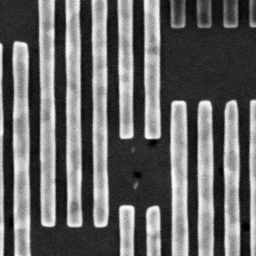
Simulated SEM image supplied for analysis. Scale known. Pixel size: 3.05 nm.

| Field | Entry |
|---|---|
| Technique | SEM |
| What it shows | wiring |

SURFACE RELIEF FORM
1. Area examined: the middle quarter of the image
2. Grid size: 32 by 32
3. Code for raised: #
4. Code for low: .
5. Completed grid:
.###...####...###...####........
.###...####...###...####........
.###...####...###...####........
.###...####...###...####........
.###...####...###...####........
.###...####...###...####........
.###...####...###...####........
.###...####...###...####........
.###...####...###...####........
.###...####...###...####...###..
.###...####...###...####...###..
.###...####...###...####...###..
.###...####...###...####...####.
.###...####...###...####...####.
.###...####...###...####...####.
.###...####...###...####...####.
.###...####...###...####...####.
.###...####...###...####...####.
.###...####...##.....###...####.
.###...####................####.
.###...####................####.
.###...####................####.
.###...####................####.
.###...####................####.
.###...####................####.
.###...####................####.
.###...####................####.
.###...####................####.
.###...####................####.
.###...####................####.
.###....###................####.
.###....###................####.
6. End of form